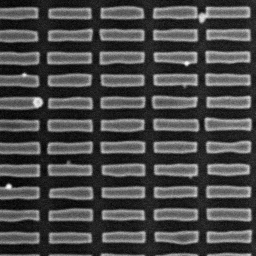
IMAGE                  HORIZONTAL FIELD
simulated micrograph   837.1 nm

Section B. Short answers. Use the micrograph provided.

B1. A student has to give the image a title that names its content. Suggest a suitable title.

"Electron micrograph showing groups of lines, slits or small figures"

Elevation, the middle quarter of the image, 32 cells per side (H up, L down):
LLLLLLLLLLLLLLLLLLLLLLLLLLLLLLLL
LLLLLLLLLLLLLLLLLLLLLLLLLLLLLLLL
LLLLLLLLLLLLLLLLLLLLLLLLLLLLLLLL
HHHHHHHLLHHHHHHHHHHHLLHHHHHHHHHH
HHHHHHHLLHHHHHHHHHHHLLHHHHHHHHHH
HHHHHLLLLLHHHHHHLLLLLLLLLLLLLLLL
LLLLLLLLLLLLLLLLLLLLLLLLLLLLLLLL
LLLLLLLLLLLLLLLLLLLLLLLLLLLLLLLL
LLHHHLLLLLHHHHHHHHHHLLHHHHHHHHLL
HHHHHHHLLHHHHHHHHHHHLLHHHHHHHHHH
HHHHHHHLLHHHHHHHHHHHLLHHHHHHHHHH
LLLLLLLLLLLLLLLLLLLLLLLLLLLLLLLL
LLLLLLLLLLLLLLLLLLLLLLLLLLLLLLLL
LLLLLLLLLLLLLLLLLLLLLLLLLLLLLLLL
HHHHHHHLLHHHHHHHHHHHLLHHHHHHHHHH
HHHHHHHLLHHHHHHHHHHHLLHHHHHHHHHH
HHHHHHHLLHHHHHHHHHHLLLLHLLHHHHHH
LLLLLLLLLLLLLLLLLLLLLLLLLLLLLLLL
LLLLLLLLLLLLLLLLLLLLLLLLLLLLLLLL
LLLLLLLLLLLLLLHHHHHHLLLLLLHHHHLL
HHHHHHHLLHHHHHHHHHHHLLHHHHHHHHHH
HHHHHHHLLHHHHHHHHHHHLLLHHHHHHHHH
LLLLLLLLLLLLLLLLLLLLLLLLLLLLLLLL
LLLLLLLLLLLLLLLLLLLLLLLLLLLLLLLL
LLLLLLLLLLLLLLLLLLLLLLLLLLLLLLLL
HHHHLLLLLLHHHHHHHHHHLLLHHHHHHHHH
HHHHHHHLLLHHHHHHHHHHLLLHHHHHHHHH
HHHHHHHLLLHHHHHHHHHHLLLHHHHHHHHH
LLLLLLLLLLLLLLLLLLLLLLLLLLLLLLLL
LLLLLLLLLLLLLLLLLLLLLLLLLLLLLLLL
LLLLLLLLLLLLLLLLLLLLLLLLLLLLLLLL
HHHHHHHLLLHHHHHHHHHHLLLHHHHHHHHH